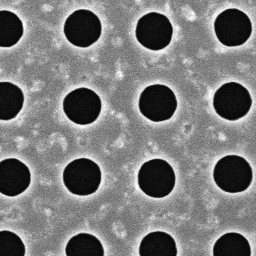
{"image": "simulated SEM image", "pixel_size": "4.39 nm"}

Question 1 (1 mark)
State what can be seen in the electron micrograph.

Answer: a regular array of holes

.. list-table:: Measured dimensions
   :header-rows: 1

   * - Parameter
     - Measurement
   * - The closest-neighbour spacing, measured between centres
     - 0.314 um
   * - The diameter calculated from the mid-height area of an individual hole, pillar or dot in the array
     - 167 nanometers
